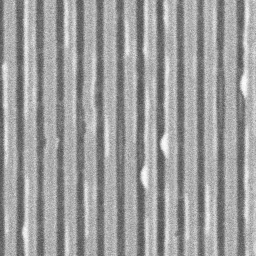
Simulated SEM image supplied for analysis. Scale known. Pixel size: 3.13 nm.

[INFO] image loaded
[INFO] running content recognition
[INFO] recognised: parallel lines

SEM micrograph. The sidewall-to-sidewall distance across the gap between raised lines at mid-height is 27.8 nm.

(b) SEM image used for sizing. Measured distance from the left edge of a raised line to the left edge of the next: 62.8 nanometres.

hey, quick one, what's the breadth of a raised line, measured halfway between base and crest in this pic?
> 33.3 nm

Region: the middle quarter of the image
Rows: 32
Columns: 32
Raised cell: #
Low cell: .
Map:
###..###..###..###..###..###..##
###..###..###..###..###..###..##
###..###..###..###..###..###..##
###..###..###..###..###..###..##
###..###..###..###..###..###..##
###..###..###..###..###..###..##
###..##...###..###..###..###..##
###..##...###..###..###..###..##
###..##...###..###..###..###..##
###..##...###..###..###..###..##
###..###..###..###...##..###...#
###..###..###..###...##..###...#
###..###..###..###...##..###...#
###..###..###..###...##..###...#
###..###..###..###...##..###...#
###...##..###..###..###..###...#
###...##..###..###..###..###...#
###..###..###..###..###..###...#
###..###..###..###..###..###...#
###..###..###..###..###.####...#
###..###..###..###..###.####...#
###..###..###..###..###..###...#
###..###..###..###..###..###...#
###..###..###..###..###..###...#
###..###..###..###..###..###...#
###..###..###..###..###..###...#
###..###...##..###..###..###...#
###..###...##..###.####..###...#
###..###...##..###.####..###...#
###..###...##..###..###..###...#
###..###...##..###..###..###...#
###..###...##..###..###..###...#